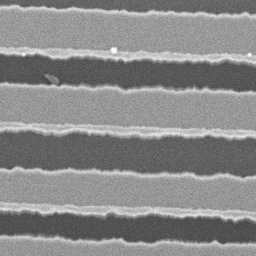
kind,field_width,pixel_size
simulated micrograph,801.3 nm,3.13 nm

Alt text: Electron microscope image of lines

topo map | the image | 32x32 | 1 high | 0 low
00000000000000000000000000000000
11111111111111110000000000000000
11111111111111111111111111111111
11111111111111111111111111111111
11111111111111111111111111111111
11111111111111111111111111111111
11111111111111111111111111111111
00000000000000011001111111111111
00000000000000000000000000000000
00000000000000000000000000000000
11100000000000000000000000000000
11111111111111111111111111111001
11111111111111111111111111111111
11111111111111111111111111111111
11111111111111111111111111111111
11111111111111111111111111111111
00000011000111111111111111111111
00000000000000000000000000000000
00000000000000000000000000000000
00000000000000000000000000000000
00000000000000000000000000000000
11111111111110100000000000000000
11111111111111111111111111111111
11111111111111111111111111111111
11111111111111111111111111111111
11111111111111111111111111111111
00000111111111111111111111111111
00000000000000000000000000000100
00000000000000000000000000000000
00000000000000000000000000000000
11111111111111111111111110110001
11111111111111111111111111111111